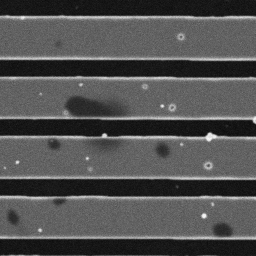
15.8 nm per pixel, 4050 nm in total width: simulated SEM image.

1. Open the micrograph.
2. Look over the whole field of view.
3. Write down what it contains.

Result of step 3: lines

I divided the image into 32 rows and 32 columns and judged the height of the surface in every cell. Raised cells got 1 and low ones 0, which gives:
00000000000000000000000000000000
00000000000000000000000000000000
11111111111111111111111111111111
11111111111111111111111111111111
11111111111111111111111111111111
11111111111111111111111111111111
11111111111111111111111111111111
00000000000000000000000111111111
00000000000000000000000000000000
00000000000000000000000000000000
11111111111111111111111111111111
11111111111111111111111111111111
11111111111111111111111111111111
11111111111111111111111111111111
11111111111111111111111111111111
00000000000000000000000000000000
00000000000000000000000000000000
11111111111111111111111111111111
11111111111111111111111111111111
11111111111111111111111111111111
11111111111111111111111111111111
11111111111111111111111111111111
00000000000000000000000000000000
00000000000000000000000000000000
00000000000000000000000000000000
11111111111111111111111111111111
11111111111111111111111111111111
11111111111111111111111111111111
11111111111111111111111111111111
11111111111111111111111111111111
00000000000000000000000000000000
00000000000000000000000000000000